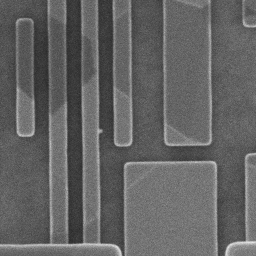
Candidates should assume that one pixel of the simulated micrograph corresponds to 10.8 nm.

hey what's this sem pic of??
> wiring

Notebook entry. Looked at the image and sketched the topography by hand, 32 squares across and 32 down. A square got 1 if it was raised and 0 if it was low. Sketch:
00000011001100110000111111000011
00000011001100110000111111000011
00110011001100110000011111000011
00110011001100110000011111000000
00110011001100110000011111000000
00110011001100110000111111000000
00110011001100110000111111000000
00110011001100110000111111000000
00110011001100110000011111000000
00110011001100110000011111000000
00110011001100110000011111000000
00110011001100110000011111000000
00110011001100110000011111000000
00110011001100110000011111000000
00110011001100110000011111000000
00110011001100110000011111000000
00110011001100110000011111000000
00000011001100110000011111000000
00000011001100000000000000000000
00000011001100000000000000000001
00000011001100001111111111100001
00000011001100001111111111100001
00000011001100001111111111100001
00000011001100001111111111100001
00000011001100001111111111100001
00000011001100001111111111100001
00000011001100001111111111100001
00000011000100001111111111100001
00000011001100001111111111100001
00000011001100001111111111100001
00000011101110001111111111100111
11111111111111111111111111101111